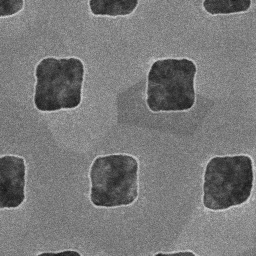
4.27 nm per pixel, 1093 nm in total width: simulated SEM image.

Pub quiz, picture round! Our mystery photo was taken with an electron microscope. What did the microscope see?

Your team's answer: holes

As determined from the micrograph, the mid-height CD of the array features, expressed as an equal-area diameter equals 235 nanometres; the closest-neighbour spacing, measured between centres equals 0.477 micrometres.